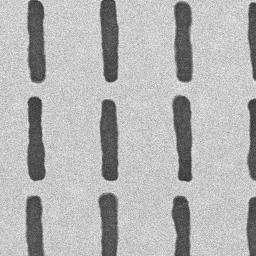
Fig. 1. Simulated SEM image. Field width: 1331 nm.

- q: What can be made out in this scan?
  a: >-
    holes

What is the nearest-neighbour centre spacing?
384 nm